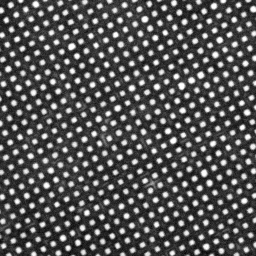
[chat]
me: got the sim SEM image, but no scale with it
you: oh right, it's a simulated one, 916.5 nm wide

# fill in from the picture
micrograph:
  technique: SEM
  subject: a regular array of raised bodies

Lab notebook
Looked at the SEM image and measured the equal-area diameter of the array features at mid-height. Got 19.4 nm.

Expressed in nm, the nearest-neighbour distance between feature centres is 38.4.